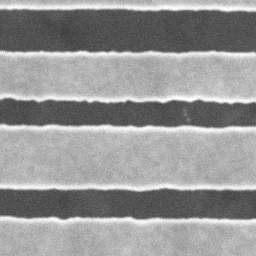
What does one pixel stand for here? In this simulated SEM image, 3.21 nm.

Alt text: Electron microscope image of lines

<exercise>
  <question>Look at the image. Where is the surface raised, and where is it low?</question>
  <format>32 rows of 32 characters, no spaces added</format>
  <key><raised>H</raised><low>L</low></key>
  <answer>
HHHHHHHHHHHHHHHHHHHHHHHHHHHHHHHH
LLLLLLLLLLLLLLLLLLLLLLLLLLLLLLLL
LLLLLLLLLLLLLLLLLLLLLLLLLLLLLLLL
LLLLLLLLLLLLLLLLLLLLLLLLLLLLLLLL
LLLLLLLLLLLLLLLLLLLLLLLLLLLLLLLL
LLLLLLLLLLLLLLLLLLLLLLLLLLLLLLLL
HLLLLHLLLLHLLLLLLLHHLLLLLLHLLLLL
HHHHHHHHHHHHHHHHHHHHHHHHHHHHHHHH
HHHHHHHHHHHHHHHHHHHHHHHHHHHHHHHH
HHHHHHHHHHHHHHHHHHHHHHHHHHHHHHHH
HHHHHHHHHHHHHHHHHHHHHHHHHHHHHHHH
HHHHHHHHHHHHHHHHHHHHHHHHHHHHHHHH
LLLLHHLLLHHHHHHHHHHHHHLHLHHHHHHH
LLLLLLLLLLLLLLLLLLLLLLLLLLLLLLLL
LLLLLLLLLLLLLLLLLLLLLLLLLLLLLLLL
LLLLLLLLLLLLLLLLLLLLLLLLLLLLLLLL
HHHHHHHHHHHHHHHHHHHHHHHHHHHHHHHH
HHHHHHHHHHHHHHHHHHHHHHHHHHHHHHHH
HHHHHHHHHHHHHHHHHHHHHHHHHHHHHHHH
HHHHHHHHHHHHHHHHHHHHHHHHHHHHHHHH
HHHHHHHHHHHHHHHHHHHHHHHHHHHHHHHH
HHHHHHHHHHHHHHHHHHHHHHHHHHHHHHHH
HHHHHHHHHHHHHHHHHHHHHHHHHHHHHHHH
HHHHHHHHHHHHHHHHHHHHHHHHHHHHHHHH
LLLLLLLLLLLLLLLLLLLLLLLLLLLLLLLL
LLLLLLLLLLLLLLLLLLLLLLLLLLLLLLLL
LLLLLLLLLLLLLLLLLLLLLLLLLLLLLLLL
HHHHHHHHHHHHHHHHHLHHHHHHHHHHHLLH
HHHHHHHHHHHHHHHHHHHHHHHHHHHHHHHH
HHHHHHHHHHHHHHHHHHHHHHHHHHHHHHHH
HHHHHHHHHHHHHHHHHHHHHHHHHHHHHHHH
HHHHHHHHHHHHHHHHHHHHHHHHHHHHHHHH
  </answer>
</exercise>